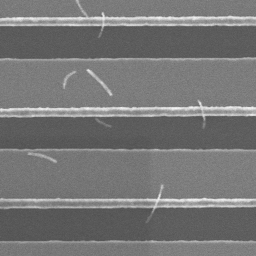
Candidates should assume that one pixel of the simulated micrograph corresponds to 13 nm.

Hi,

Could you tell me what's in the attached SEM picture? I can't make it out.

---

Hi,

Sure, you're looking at lines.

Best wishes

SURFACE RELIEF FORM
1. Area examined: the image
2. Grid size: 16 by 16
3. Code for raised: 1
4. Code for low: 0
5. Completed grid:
1111111111111111
1111111111111111
0000000000000000
0000000000000000
1111111111111111
1111111111111111
1111111111111111
0000000000000000
0000000000000000
1111111111111111
1111111111111111
1111111111111111
1111111111111111
0000000000000000
0000000000000000
1111111111111111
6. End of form